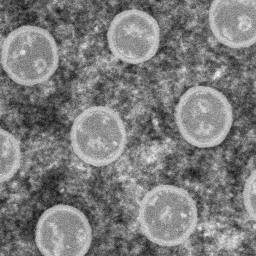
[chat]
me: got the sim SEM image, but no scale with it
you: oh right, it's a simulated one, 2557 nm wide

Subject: raised bodies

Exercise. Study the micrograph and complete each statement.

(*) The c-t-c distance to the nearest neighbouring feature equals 1050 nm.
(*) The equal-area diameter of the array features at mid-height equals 0.546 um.